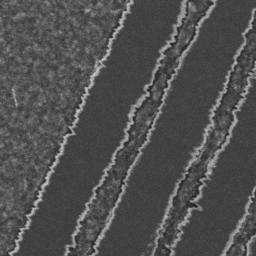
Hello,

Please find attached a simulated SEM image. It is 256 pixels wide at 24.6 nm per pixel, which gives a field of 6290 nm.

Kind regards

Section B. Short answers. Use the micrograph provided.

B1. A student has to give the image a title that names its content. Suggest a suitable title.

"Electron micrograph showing one or a few lines or trenches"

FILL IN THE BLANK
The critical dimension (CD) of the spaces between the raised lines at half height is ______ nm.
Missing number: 496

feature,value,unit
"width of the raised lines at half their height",1240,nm